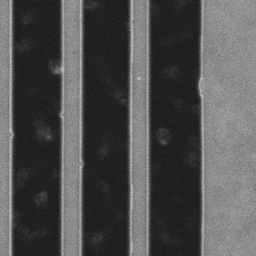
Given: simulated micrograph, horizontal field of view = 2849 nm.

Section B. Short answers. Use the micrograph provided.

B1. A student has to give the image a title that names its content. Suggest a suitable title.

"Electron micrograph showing one or a few lines or trenches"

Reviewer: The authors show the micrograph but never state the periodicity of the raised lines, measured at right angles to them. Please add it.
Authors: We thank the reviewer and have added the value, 768 nm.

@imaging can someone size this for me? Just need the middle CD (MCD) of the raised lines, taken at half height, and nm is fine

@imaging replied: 590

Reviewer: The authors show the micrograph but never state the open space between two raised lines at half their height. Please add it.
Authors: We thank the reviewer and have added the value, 15.8 px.